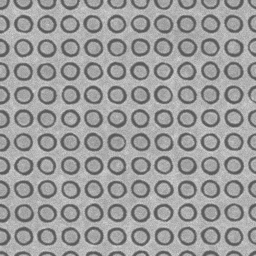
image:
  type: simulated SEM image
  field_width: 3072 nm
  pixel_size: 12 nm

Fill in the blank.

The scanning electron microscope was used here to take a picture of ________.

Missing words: a regular array of ring-shaped grooves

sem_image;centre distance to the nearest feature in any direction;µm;0.272